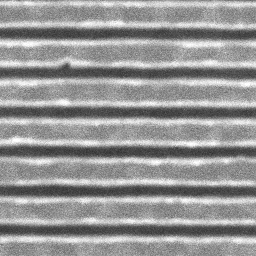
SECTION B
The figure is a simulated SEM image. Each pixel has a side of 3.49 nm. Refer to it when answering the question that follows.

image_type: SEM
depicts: parallel lines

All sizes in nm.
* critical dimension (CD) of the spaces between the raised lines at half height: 48.4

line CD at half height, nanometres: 88.1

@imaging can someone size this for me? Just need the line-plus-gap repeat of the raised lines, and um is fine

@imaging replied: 0.137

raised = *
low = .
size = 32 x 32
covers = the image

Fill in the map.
********************************
********************************
********************************
................................
................................
********************************
********************************
********************************
................................
................................
********************************
********************************
********************************
................................
................................
********************************
********************************
********************************
................................
................................
********************************
********************************
********************************
................................
................................
********************************
********************************
********************************
................................
................................
********************************
********************************